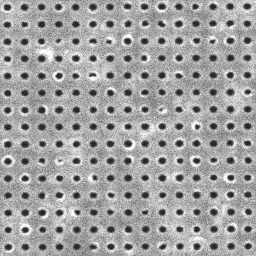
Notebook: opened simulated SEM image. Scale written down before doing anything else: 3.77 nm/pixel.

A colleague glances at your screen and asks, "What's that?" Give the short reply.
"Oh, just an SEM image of a regular array of holes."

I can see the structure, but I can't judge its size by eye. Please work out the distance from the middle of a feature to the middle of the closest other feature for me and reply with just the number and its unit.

63.4 nm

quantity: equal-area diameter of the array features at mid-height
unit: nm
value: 25.1